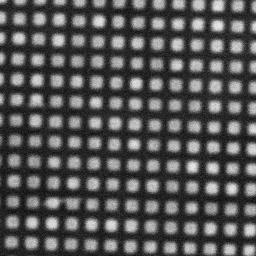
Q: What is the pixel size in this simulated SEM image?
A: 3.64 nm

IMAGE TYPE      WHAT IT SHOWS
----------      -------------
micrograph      a regular array of raised bodies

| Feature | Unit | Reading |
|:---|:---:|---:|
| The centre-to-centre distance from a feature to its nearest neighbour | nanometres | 71.3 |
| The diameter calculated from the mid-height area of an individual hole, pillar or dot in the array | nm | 41.1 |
